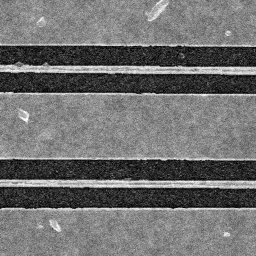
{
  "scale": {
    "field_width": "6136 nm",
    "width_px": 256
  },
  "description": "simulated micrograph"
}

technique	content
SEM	lines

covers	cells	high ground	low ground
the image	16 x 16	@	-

@@@@@@@@@@@@@@@@
@@@@@@@@@@@@@@@@
@@@@@@@@@@@@@@@@
----------------
----------------
----------------
@@@@@@@@@@@@@@@@
@@@@@@@@@@@@@@@@
@@@@@@@@@@@@@@@@
@@@@@@@@@@@@@@@@
----------------
----------------
----------------
@@@@@@@@@@@@@@@@
@@@@@@@@@@@@@@@@
@@@@@@@@@@@@@@@@